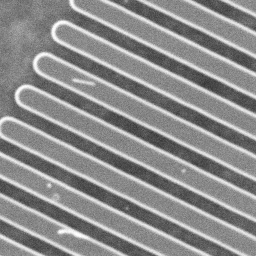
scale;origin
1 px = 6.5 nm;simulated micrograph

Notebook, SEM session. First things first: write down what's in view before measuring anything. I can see groups of lines, slits or small figures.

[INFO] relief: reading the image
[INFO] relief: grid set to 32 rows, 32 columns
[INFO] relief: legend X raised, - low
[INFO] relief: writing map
---------XXXXX----XXXXXXX----XXX
----------XXXXXX-----XXXXX-----X
------------XXXXXX-----XXXXXX---
-------XXX----XXXXXX-----XXXXXX-
-------XXXXX----XXXXXX-----XXXXX
--------XXXXXX----XXXXXX-----XXX
----------XXXXXX----XXXXXX-----X
----XXXX----XXXXXX----XXXXXX----
----XXXXXX----XXXXXX----XXXXXX--
------XXXXXX----XXXXXX----XXXXXX
--------XXXXXX----XXXXXX----XXXX
--XXX-----XXXXXX----XXXXXX----XX
--XXXXX-----XXXXXX----XXXXXX----
---XXXXXX-----XXXXXX----XXXXXX--
-----XXXXXX-----XXXXXX----XXXXXX
XXX----XXXXXX-----XXXXXX----XXXX
XXXXX----XXXXXX-----XXXXXX----XX
-XXXXXX----XXXXXX-----XXXXXX----
---XXXXXX----XXXXXX-----XXXXXX--
X----XXXXXX----XXXXXXX----XXXXXX
XXX----XXXXXX-----XXXXXX----XXXX
XXXXX----XXXXXX-----XXXXX-----XX
-XXXXXX----XXXXXX-----XXXXXX----
---XXXXXX----XXXXXX-----XXXXXX--
-----XXXXXX----XXXXXX-----XXXXXX
XX-----XXXXXX----XXXXXX-----XXXX
XXXXX----XXXXXX----XXXXXX-----XX
-XXXXXX----XXXXXX----XXXXXX-----
---XXXXXX----XXXXXX----XXXXXX---
-----XXXXXX----XXXXXX----XXXXXX-
XX-----XXXXXX----XXXXXX----XXXXX
XXXX-----XXXXXX----XXXXXX----XXX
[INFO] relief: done